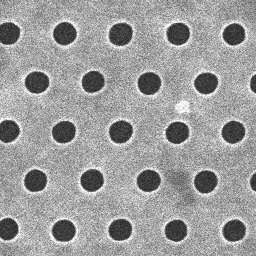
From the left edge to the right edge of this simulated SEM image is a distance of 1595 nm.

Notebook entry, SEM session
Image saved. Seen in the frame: a regular array of holes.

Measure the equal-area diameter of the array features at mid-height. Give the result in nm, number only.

143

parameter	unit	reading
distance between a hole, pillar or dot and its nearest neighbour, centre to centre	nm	349